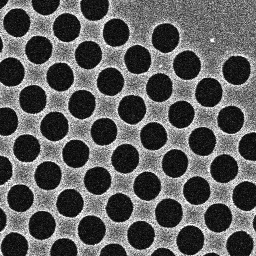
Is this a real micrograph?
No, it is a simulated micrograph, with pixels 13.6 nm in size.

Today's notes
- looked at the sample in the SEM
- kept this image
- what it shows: a regular array of holes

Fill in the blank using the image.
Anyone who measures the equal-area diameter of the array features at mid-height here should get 386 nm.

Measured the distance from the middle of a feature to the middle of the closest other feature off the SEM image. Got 470 nm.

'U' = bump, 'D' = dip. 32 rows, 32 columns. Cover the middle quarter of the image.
DUUUDDDDUUUUUUUDDDDDDUUUUUUDDDDD
DDUUUUUUUUDDDDUUDDDDDUUUUUUDDDDD
DDUUUUUUUDDDDDUUUDDUUUUDDUUUDDDD
DDDUUUUUDDDDDDDUUUUUUDDDDDUUUDDD
DDUUUUUUDDDDDDDUUUUUUDDDDDDUUUUU
DDUUUUUUDDDDDDDUUUUUDDDDDDDUUUUU
DUUUDUUUUDDDDDUUUUUUDDDDDDDUUUUU
UUDDDDDUUUDDDUUUUUUUUDDDDDDUUUUU
UDDDDDDDUUUUUUUDDDDUUDDDDDUUUUUU
UDDDDDDDUUUUUUDDDDDDUUUDDUUUDDDU
UDDDDDDDUUUUUDDDDDDDUUUUUUUDDDDD
UDDDDDDDUUUUUDDDDDDDDUUUUUDDDDDD
UUDDDDDUUUUUUUDDDDDDUUUUUUDDDDDD
DUUDDDUUUDDUUUDDDDDDUUUUUUDDDDDD
DUUUUUUDDDDDDUUDDDDUUUDUUUDDDDDD
DUUUUUUDDDDDDUUUUUUUDDDDDUUDDDDU
DUUUUUUDDDDDDUUUUUUDDDDDDUUUUUUU
DUUUUUUDDDDDDUUUUUUDDDDDDDUUUUUU
UUUUUUUDDDDDDUUUUUUDDDDDDDUUUUUD
UDDDDUUUDDDDUUUUUUUDDDDDDDUUUUUD
DDDDDDUUUUUUUUDDDUUUDDDDDUUUUUUD
DDDDDDUUUUUUUDDDDDUUUDDUUUDDDUUU
DDDDDDUUUUUUDDDDDDDUUUUUUDDDDDUU
DDDDDDUUUUUUDDDDDDDUUUUUUDDDDDDU
DDDDDDUUUUUUDDDDDDDUUUUUDDDDDDDU
UDDDDUUUUUUUDDDDDDUUUUUUDDDDDDDU
UUUUUUDDDDDUUDDDDDUUUUUUUDDDDDDU
UUUUUDDDDDDUUUUUUUUDDDDUUDDDDDUU
UUUUUDDDDDDDUUUUUUDDDDDDUUUDUUUD
UUUUUDDDDDDDUUUUUDDDDDDDUUUUUUUD
UUUUUDDDDDDDUUUUUDDDDDDDUUUUUUDD
DDDUUUDDDDDUUUUUUDDDDDDDUUUUUUDD